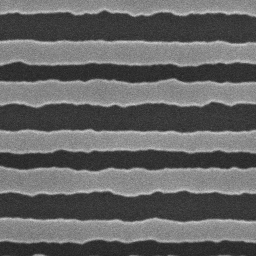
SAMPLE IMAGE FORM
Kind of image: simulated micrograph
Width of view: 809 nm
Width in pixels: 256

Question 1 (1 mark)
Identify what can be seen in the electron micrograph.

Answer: lines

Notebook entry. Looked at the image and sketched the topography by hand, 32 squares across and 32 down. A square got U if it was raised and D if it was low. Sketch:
UUUUUUUUUUUUUUUUUUUUUUUUUUUUUUUU
UUUUUUUDDUUUDDUUUUUUDUUUUUUUUUUU
DDDDDDDDDDDDDDDDDDDDDDDDDDDDDDDD
DDDDDDDDDDDDDDDDDDDDDDDDDDDDDDDD
DDDDDDDDDDDDDDDDDDDDDDDDDDDDDDDD
UUUUUUUUUUUUUUUUUUUUUUUUUUUUUDUU
UUUUUUUUUUUUUUUUUUUUUUUUUUUUUUUU
UUUUUUUUUUUUUUUUUUUUUUUUUUUUUUUU
DDDDDDDDDDDDDDDDDDDDDDDDDDDDDDDD
DDDDDDDDDDDDDDDDDDDDDDDDDDDDDDDD
UUUUUUUUUUUUUUUUUUUUUUUUUUUUUUUU
UUUUUUUUUUUUUUUUUUUUUUUUUUUUUUUU
UUUUUUUUUUUUUUUUUUUUUUUUUUUUUUUU
DDDDDDDDDDDDDDDDDDDDDDDDDDDDDDDD
DDDDDDDDDDDDDDDDDDDDDDDDDDDDDDDD
DDDDDDDDDDDDDDDDDDDDDDDDDDDDDDDD
UUUUUDUUUUUUUUUUUUUUDUDDDUUDUDUU
UUUUUUUUUUUUUUUUUUUUUUUUUUUUUUUU
UUUUUUUUUUUUUUUUUUUUUUUUUUUUUUUU
DDDDDDDDDDDDDDDDDDDDDDDDDDDDDDDD
DDDDDDDDDDDDDDDDDDDDDDDDDDDDDDDD
UUUUUUUUUUUDUUUUUUUUUUUUUUUUUUUU
UUUUUUUUUUUUUUUUUUUUUUUUUUUUUUUU
UUUUUUUUUUUUUUUUUUUUUUUUUUUUUUUU
DDDDDDDDDDDDDDDDDDDDDDDDDDDDDDDD
DDDDDDDDDDDDDDDDDDDDDDDDDDDDDDDD
DDDDDDDDDDDDDDDDDDDDDDDDDDDDDDDD
UUUUUUUUUUDDDDUDDDUUUDDDDDUUUDDD
UUUUUUUUUUUUUUUUUUUUUUUUUUUUUUUU
UUUUUUUUUUUUUUUUUUUUUUUUUUUUUUUU
DDDDDDDDDDDDDDDDDDDDDDDDDDDDDDDD
DDDDDDDDDDDDDDDDDDDDDDDDDDDDDDDD